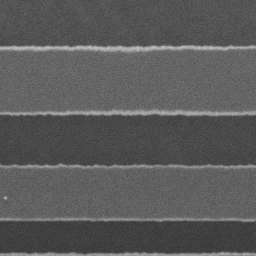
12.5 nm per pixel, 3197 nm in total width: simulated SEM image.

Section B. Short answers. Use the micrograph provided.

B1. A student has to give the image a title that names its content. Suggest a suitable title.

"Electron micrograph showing lines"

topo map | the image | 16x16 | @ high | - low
----------------
----------------
----------------
@@@@@@@@@@@@@@@@
@@@@@@@@@@@@@@@@
@@@@@@@@@@@@@@@@
@@@@@@@@@@@@@@@@
----------------
----------------
----------------
@@@@@@@@@@@@@@@@
@@@@@@@@@@@@@@@@
@@@@@@@@@@@@@@@@
@@@@@@@@@@@@@@@@
----------------
----------------